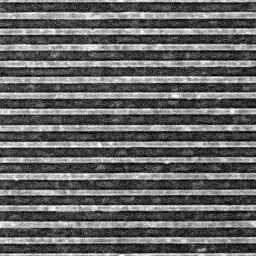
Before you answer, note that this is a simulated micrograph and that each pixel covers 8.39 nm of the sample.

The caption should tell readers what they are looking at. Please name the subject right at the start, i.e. parallel lines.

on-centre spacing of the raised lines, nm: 134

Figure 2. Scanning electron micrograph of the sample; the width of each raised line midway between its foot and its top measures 42 nm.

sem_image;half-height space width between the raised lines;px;10.9